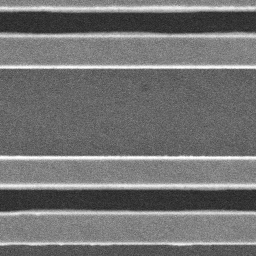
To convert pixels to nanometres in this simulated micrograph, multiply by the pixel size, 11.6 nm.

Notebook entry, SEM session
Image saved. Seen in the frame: lines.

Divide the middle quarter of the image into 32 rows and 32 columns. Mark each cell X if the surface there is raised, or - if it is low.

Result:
XXXXXXXXXXXXXXXXXXXXXXXXXXXXXXXX
--------------------------------
--------------------------------
--------------------------------
--------------------------------
--------------------------------
--------------------------------
--------------------------------
--------------------------------
--------------------------------
--------------------------------
--------------------------------
--------------------------------
--------------------------------
--------------------------------
--------------------------------
--------------------------------
--------------------------------
--------------------------------
--------------------------------
--------------------------------
--------------------------------
--------------------------------
--XXXXX-----------XX-X----------
XXXXXXXXXXXXXXXXXXXXXXXXXXXXXXXX
XXXXXXXXXXXXXXXXXXXXXXXXXXXXXXXX
XXXXXXXXXXXXXXXXXXXXXXXXXXXXXXXX
XXXXXXXXXXXXXXXXXXXXXXXXXXXXXXXX
XXXXXXXXXXXXXXXXXXXXXXXXXXXXXXXX
XXXXXXXXXXXXXXXXXXXXXXXXXXXXXXXX
XXXXXXXXXXXXXXXXXXXXXXXXXXXXXXXX
--------------------------------